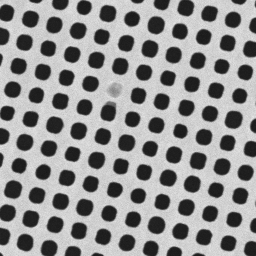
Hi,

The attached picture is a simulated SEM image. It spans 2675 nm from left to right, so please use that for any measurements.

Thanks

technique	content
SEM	a regular array of holes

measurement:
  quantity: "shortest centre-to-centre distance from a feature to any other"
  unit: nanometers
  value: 251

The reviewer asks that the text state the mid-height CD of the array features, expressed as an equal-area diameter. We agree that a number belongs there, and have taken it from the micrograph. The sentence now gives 0.172 um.